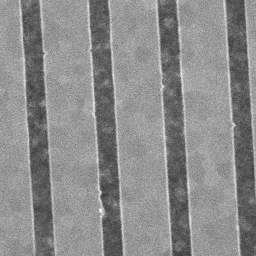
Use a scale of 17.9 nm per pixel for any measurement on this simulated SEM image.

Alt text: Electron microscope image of one or a few lines or trenches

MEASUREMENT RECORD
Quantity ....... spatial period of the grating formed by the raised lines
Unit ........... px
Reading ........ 68.1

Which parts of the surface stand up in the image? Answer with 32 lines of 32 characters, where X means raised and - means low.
XXX--XXXXXX---XXXXXX--XXXXXX---X
XXX--XXXXXX---XXXXXX--XXXXXX---X
XXX--XXXXXX---XXXXXX--XXXXXX---X
XXX--XXXXXX---XXXXXX--XXXXXX---X
XXX--XXXXXX---XXXXXX--XXXXXX---X
XXX--XXXXXX---XXXXXX---XXXXX---X
XXX---XXXXX---XXXXXX---XXXXX---X
XXX---XXXXX---XXXXXX---XXXXX---X
XXX---XXXXXX--XXXXXX---XXXXXX--X
XXX---XXXXXX--XXXXXX---XXXXXX--X
XXX---XXXXXX--XXXXXX---XXXXXX--X
XXX---XXXXXX--XXXXXX---XXXXXX--X
XXX---XXXXXX--XXXXXX---XXXXXX--X
XXX---XXXXXX--XXXXXX---XXXXXX--X
XXX---XXXXXX--XXXXXX---XXXXXX--X
XXX---XXXXXX---XXXXX---XXXXXX---
XXX---XXXXXX---XXXXXX--XXXXXX---
XXXX--XXXXXX---XXXXXX--XXXXXX---
XXXX--XXXXXX---XXXXXX--XXXXXX---
XXXX--XXXXXX---XXXXXX--XXXXXX---
XXXX--XXXXXX---XXXXXX--XXXXXX---
XXXX--XXXXXX---XXXXXX--XXXXXX---
XXXX--XXXXXX---XXXXXX--XXXXXX---
XXXX--XXXXXX---XXXXXX---XXXXX---
XXXX---XXXXXX--XXXXXX---XXXXX---
XXXX---XXXXXX--XXXXXX---XXXXXX--
XXXX---XXXXXX--XXXXXX---XXXXXX--
XXXX---XXXXXX--XXXXXX---XXXXXX--
XXXX---XXXXXX--XXXXXX---XXXXXX--
XXXX---XXXXXX--XXXXXX---XXXXXX--
XXXX---XXXXXX--XXXXXX---XXXXXX--
XXXX---XXXXXX--XXXXXX---XXXXXX--